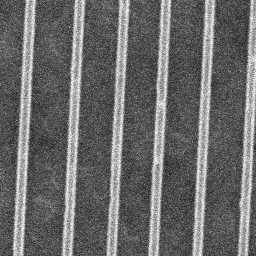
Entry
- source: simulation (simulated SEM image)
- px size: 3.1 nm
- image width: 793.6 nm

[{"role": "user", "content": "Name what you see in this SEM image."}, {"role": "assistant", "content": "parallel lines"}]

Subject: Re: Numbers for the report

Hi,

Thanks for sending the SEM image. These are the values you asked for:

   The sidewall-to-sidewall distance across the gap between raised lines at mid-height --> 112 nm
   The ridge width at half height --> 26.3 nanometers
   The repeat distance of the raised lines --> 0.139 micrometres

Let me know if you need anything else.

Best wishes